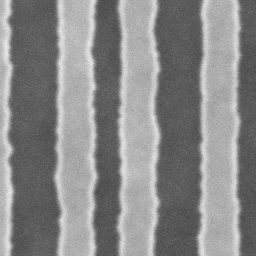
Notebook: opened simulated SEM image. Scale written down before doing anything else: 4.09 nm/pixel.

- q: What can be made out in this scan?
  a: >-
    lines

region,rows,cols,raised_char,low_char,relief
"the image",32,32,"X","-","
X------XXXXX---XXXXX-----XXXXX--
X------XXXXX---XXXX------XXXXX--
X------XXXXX---XXXX------XXXXX--
X------XXXXX---XXXX------XXXXX--
X------XXXXX---XXXX------XXXXX--
X------XXXX----XXXX------XXXXX--
X-------XXX----XXXXX-----XXXXX--
X------XXXXX---XXXXX-----XXXXX--
X------XXXXX---XXXXX-----XXXXX--
X------XXXXX---XXXXX-----XXXXX--
X------XXXXX---XXXXX-----XXXXX--
X------XXXXX---XXXX------XXXX---
X------XXXXX---XXXX------XXXXX--
X------XXXXX---XXXX------XXXX---
X------XXXXX---XXXX------XXXXX--
X------XXXXX---XXXXX-----XXXXX--
X------XXXXX---XXXXX-----XXXXX--
X------XXXXX---XXXXX-----XXXX---
X------XXXXX---XXXXX-----XXXXX--
X------XXXXX---XXXXX-----XXXX---
X------XXXXX---XXXX------XXXXX--
X------XXXXX---XXXX------XXXXX--
X------XXXXX---XXXX------XXXXX--
X------XXXXX---XXXX------XXXX---
X------XXXXX---XXXXX-----XXXXX--
X-------XXXX---XXXXX-----XXXXX--
X-------XXXX---XXXXX-----XXXXX--
X-------XXXX---XXXXX-----XXXXX--
X-------XXXX---XXXX------XXXXX--
X-------XXXX---XXXX------XXXXX--
X------XXXXX---XXXX------XXXXX--
X------XXXXX---XXXX------XXXXX--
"